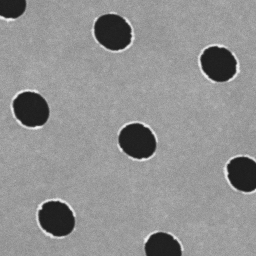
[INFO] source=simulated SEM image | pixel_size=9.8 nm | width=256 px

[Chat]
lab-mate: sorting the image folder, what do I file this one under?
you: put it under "holes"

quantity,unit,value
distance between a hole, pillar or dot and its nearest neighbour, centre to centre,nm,1090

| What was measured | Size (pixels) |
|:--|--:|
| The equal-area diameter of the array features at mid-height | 35.8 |